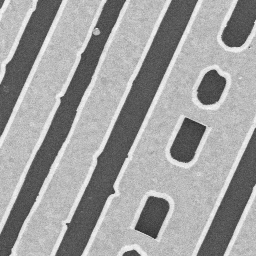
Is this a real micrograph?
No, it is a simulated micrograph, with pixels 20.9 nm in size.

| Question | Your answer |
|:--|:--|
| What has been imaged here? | one or a few lines or trenches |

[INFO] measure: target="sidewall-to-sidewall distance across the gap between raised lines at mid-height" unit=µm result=0.591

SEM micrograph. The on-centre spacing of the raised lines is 1290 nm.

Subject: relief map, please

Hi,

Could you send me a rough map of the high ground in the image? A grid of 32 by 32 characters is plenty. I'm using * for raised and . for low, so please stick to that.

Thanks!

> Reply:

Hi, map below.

.***....*****...*****....****...
****....****...*****.....****...
***....*****...*****....****....
***....****...*****.....****....
**....*****...*****....****....*
**....*****...*****....*****...*
**...*****...*****....**********
*....*****...*****....**********
....*****...*****....*****.*****
....*****...*****....****...****
....****....****....*****....***
...*****...*****....****....****
...****....****....*****....****
..*****...*****....*************
..****....****.....*************
.*****...*****....****...*******
.****....****.....****....*****.
*****...*****....****....******.
*****...*****....****....*****..
****...*****....*****....*****..
****...*****....******..*****...
***....****....**************...
***...*****....**************...
**...*****.....*************....
**...*****....****...*******....
*....****.....****...******....*
*...*****....****....******....*
...*****.....****....*****....**
...*****....*****...******....**
...*****....*******.*****....***
..*****....**************....***
..*****....****...******.....***